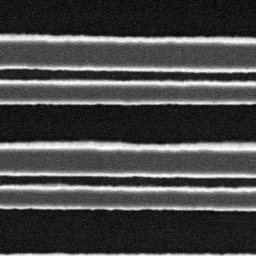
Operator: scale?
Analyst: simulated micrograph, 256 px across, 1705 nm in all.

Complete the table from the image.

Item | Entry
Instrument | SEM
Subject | lines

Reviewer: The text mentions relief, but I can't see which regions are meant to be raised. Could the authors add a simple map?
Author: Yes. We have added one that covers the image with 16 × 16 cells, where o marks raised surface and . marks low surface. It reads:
................
................
ooooooooo.o.....
oooooooooooooooo
oooooooooooooooo
oooooooooooooooo
................
................
................
oooooooooooooooo
oooooooooooooooo
oooooooooooooooo
oooooooooooooooo
................
................
................